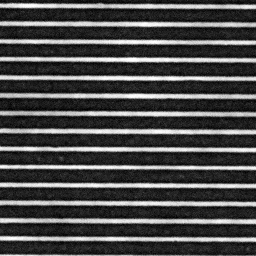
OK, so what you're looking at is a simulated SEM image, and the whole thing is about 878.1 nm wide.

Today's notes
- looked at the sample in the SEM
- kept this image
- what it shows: parallel lines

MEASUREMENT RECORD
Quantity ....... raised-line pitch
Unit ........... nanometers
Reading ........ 61.4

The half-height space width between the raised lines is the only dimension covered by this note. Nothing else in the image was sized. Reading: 50.6 nm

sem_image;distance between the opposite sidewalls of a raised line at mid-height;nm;13.3